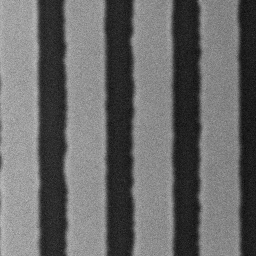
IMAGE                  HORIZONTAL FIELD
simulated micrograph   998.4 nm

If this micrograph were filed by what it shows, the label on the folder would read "lines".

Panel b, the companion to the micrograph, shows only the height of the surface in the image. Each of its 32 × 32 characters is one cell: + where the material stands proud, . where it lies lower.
+++++...+++++....++++....+++++..
+++++...+++++....++++....+++++..
+++++...+++++....++++....+++++..
+++++...+++++....++++....+++++..
+++++...+++++....++++....+++++..
+++++...+++++....++++....+++++..
+++++...+++++....++++....+++++..
+++++...+++++....++++....+++++..
+++++...+++++....++++....+++++..
+++++...+++++....++++....+++++..
+++++...+++++....++++....+++++..
+++++...+++++....++++....+++++..
+++++...+++++....++++....+++++..
+++++...+++++....++++....+++++..
+++++...+++++....++++....+++++..
+++++...+++++....++++....+++++..
+++++...+++++....+++++...+++++..
+++++...+++++....+++++...+++++..
+++++....++++....++++....+++++..
+++++...+++++....++++....+++++..
+++++...+++++....++++....+++++..
+++++...+++++....++++....+++++..
+++++...+++++....+++++...+++++..
+++++....++++....++++....+++++..
+++++...+++++....++++....+++++..
+++++...+++++....++++....+++++..
+++++...+++++....++++....+++++..
+++++....++++....++++....+++++..
+++++....++++....++++....+++++..
+++++...+++++....+++++...+++++..
+++++...+++++....++++....+++++..
+++++...+++++....+++++...+++++..